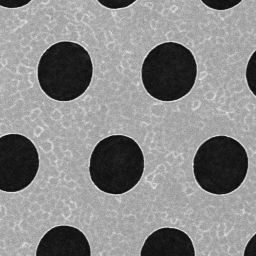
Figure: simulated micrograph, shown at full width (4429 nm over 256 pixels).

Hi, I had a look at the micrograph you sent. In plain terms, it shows holes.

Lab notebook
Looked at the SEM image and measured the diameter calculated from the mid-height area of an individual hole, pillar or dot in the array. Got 0.994 microns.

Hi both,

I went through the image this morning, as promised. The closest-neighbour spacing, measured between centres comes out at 1800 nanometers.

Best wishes